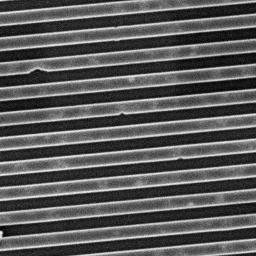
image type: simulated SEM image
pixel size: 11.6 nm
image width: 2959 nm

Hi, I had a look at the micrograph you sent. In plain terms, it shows parallel lines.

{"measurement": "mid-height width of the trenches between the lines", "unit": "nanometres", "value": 138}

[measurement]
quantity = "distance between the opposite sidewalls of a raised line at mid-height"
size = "148 nm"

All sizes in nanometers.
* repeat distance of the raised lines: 288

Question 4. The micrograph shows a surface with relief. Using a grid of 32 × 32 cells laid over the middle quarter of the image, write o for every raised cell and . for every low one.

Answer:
ooooooooo.......................
................................
......................oooooooooo
...........ooooooooooooooooooooo
.ooooooooooooooooooooooooooooooo
oooooooooooooooooooooo..........
oooooooooooo....................
o...............................
.........................ooooooo
..............oooooooooooooooooo
...ooooooooooooooooooooooooooooo
ooooooooooooooooooooooooo.......
oooooooooooooo..................
ooo.............................
...........................ooooo
................oooooooooooooooo
.....ooooooooooooooooooooooooooo
ooooooooooooooooooooooooooo.....
oooooooooooooooo................
oooooo..........................
.............................ooo
..................oooooooooooooo
........oooooooooooooooooooooooo
ooooooooooooooooooooooooooooo...
ooooooooooooooooooo.............
oooooooo........................
................................
.......................ooooooooo
............oooooooooooooooooooo
.ooooooooooooooooooooooooooooooo
ooooooooooooooooooooooo.........
oooooooooo......................